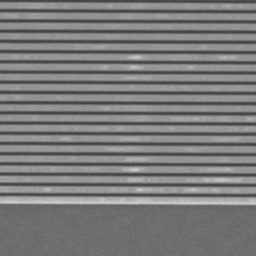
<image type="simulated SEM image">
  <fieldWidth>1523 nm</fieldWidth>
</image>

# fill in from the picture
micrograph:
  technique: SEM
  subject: parallel lines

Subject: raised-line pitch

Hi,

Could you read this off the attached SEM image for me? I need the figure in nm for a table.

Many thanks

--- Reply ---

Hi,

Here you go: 60.7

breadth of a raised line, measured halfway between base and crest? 37.9 nm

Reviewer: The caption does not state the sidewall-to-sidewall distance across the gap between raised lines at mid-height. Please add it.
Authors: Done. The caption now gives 3.63 px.